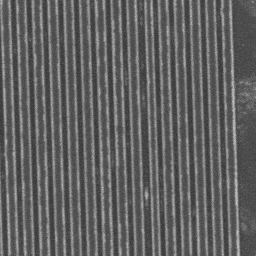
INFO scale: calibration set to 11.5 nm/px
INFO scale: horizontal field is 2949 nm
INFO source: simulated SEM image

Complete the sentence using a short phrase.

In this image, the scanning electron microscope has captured parallel lines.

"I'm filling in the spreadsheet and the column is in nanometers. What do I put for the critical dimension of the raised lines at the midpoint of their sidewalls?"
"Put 108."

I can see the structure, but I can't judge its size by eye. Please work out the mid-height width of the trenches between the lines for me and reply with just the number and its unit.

76.2 nm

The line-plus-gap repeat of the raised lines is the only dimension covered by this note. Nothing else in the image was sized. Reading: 182 nm